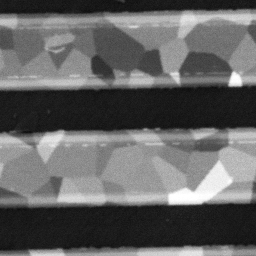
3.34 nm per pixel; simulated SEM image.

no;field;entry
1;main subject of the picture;one or a few lines or trenches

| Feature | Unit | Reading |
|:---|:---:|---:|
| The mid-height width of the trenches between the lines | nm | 185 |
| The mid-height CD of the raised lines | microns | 0.21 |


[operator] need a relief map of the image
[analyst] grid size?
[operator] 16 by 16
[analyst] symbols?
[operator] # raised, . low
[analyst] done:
................
################
################
################
################
................
................
................
.............###
################
################
################
####............
................
................
................